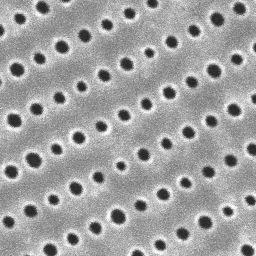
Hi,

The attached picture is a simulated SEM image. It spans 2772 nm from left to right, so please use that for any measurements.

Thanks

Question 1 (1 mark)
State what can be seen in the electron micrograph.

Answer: a regular array of holes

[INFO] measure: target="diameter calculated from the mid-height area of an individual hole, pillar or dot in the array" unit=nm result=144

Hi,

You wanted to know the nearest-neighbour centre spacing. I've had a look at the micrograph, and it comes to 271 nm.